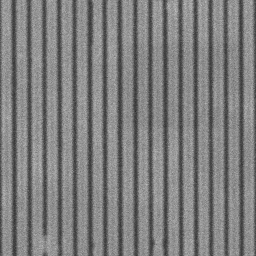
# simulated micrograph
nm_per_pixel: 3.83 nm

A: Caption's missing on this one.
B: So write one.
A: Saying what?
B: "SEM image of parallel lines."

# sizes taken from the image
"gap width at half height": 19.2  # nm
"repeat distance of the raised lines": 58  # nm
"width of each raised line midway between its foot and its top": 0.0378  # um